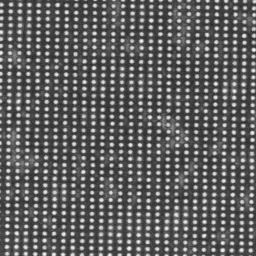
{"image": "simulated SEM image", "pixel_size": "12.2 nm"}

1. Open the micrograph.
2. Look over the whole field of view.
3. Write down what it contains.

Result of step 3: a regular array of raised bodies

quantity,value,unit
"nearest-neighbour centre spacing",0.0825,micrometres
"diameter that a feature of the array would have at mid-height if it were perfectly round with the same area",41.3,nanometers